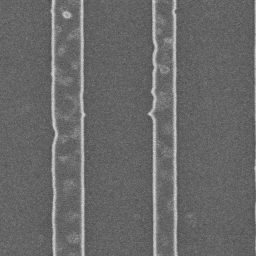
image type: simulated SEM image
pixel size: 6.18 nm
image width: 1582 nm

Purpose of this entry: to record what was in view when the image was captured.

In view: one or a few lines or trenches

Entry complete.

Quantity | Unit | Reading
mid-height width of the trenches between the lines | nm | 441